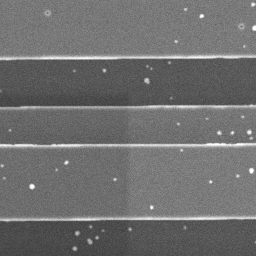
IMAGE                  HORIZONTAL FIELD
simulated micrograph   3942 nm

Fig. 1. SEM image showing lines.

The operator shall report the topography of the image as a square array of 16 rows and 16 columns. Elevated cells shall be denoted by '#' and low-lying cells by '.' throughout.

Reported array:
################
################
################
################
................
................
................
################
################
################
################
################
################
################
................
................